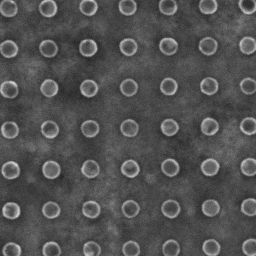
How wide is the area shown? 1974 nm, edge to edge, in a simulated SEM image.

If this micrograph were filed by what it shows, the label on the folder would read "a regular array of raised bodies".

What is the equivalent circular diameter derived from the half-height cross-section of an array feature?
129 nm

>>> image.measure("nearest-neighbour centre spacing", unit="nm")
306